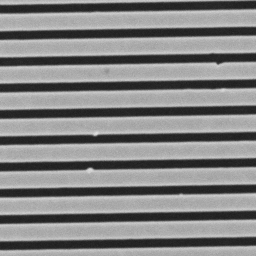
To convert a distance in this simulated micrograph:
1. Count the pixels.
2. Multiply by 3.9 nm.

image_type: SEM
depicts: parallel lines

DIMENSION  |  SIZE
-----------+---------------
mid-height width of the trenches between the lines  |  34.1 nanometres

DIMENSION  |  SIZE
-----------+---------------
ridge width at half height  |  67.7 nm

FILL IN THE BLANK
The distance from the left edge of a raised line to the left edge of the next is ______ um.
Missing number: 0.103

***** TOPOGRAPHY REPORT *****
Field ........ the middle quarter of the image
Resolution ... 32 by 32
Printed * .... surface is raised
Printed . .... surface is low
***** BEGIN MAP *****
********************************
********************************
********************************
********************************
**..............................
................................
.........................*******
********************************
********************************
********************************
******************************..
................................
................................
..........**********************
********************************
********************************
********************************
***************.................
................................
................................
********************************
********************************
********************************
********************************
................................
................................
.....***..**********************
********************************
********************************
********************************
***************.................
................................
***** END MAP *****